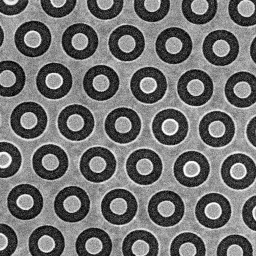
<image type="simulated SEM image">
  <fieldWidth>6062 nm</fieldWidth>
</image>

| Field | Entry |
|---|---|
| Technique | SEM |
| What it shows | an array of small figures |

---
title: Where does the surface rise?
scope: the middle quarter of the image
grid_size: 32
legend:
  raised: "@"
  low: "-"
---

@@@@@@@----@@@@@@@@@@@@@@@@@@@@@
-@@@@@-------@@@@@------@@@@@@@-
--@@@--------@@@@--------@@@@@--
--@@@---@@@---@@@--------@@@@---
--@@@--@@@@---@@@--@@@@---@@---@
--@@@--@@@@---@@---@@@@---@@---@
--@@@----@---@@@@---@@@---@@---@
-@@@@@-------@@@@---------@@----
@@@@@@@-----@@@@@@-------@@@@---
@@@@@@@@@@@@@@@@@@@-----@@@@@@--
@----@@@@@@@@@@@@@@@@@@@@@@@@@@-
------@@@@@@-----@@@@@@@-----@@@
-------@@@@--------@@@@-------@@
-@@@----@@----@----@@@---------@
-@@@@---@@---@@@@--@@@---@@@---@
-@@@@---@@---@@@@---@@---@@@---@
--@----@@@---@@@---@@@---@@@---@
-------@@@---------@@@----@----@
------@@@@@-------@@@@@-------@@
@@@-@@@@@@@@@----@@@@@@-------@@
@@@@@@@@-@@@@@@@@@@@@@@@@--@@@@@
@@@@@@-----@@@@@@@----@@@@@@@@@@
-@@@@-------@@@@-------@@@@@@---
-@@@---@@----@@@--------@@@@----
-@@@---@@@---@@---@@@@---@@@----
-@@@--@@@@---@@---@@@@---@@---@@
-@@@---@@@---@@---@@@@---@@---@@
@@@@---------@@@----@----@@---@@
@@@@@-------@@@@--------@@@@----
@@@@@@@---@@@@@@@------@@@@@----
@--@@@@@@@@@@@@@@@@--@@@@@@@@@--
-----@@@@@@@----@@@@@@@@@-@@@@@@